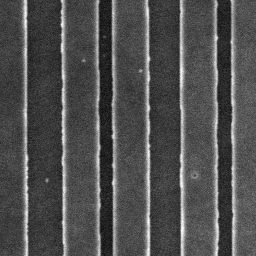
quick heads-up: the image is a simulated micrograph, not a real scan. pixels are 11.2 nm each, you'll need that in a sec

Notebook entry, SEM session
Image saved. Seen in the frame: lines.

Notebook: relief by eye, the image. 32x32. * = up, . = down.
***.....****..****.....****..***
***.....****..*****....****..***
***.....****..*****....****..***
***.....****..*****....****..***
***.....****..*****....****..***
***.....****..*****....****..***
***.....****..*****....****..***
***.....****..*****....****..***
***.....****..*****....****..***
***.....****..*****....****..***
***.....****..*****....****..***
***.....****..*****....****..***
***.....****..*****....****..***
***.....****..*****....****..***
***.....****..*****....****..***
***.....****..*****....****..***
***.....****..*****....****..***
***.....****..*****....****..***
***.....****..*****....****..***
***.....****..*****....****..***
***.....****..*****....****..***
***.....****..*****....****..***
***.....****..*****....****..***
***.....****..*****....****..***
***.....****..*****....****..***
***.....****..*****....****..***
***.....****..*****....****..***
***.....****..*****....****..***
***.....****..*****....****..***
***.....****..*****....****..***
***.....****..*****....****..***
***.....****..*****....****..***